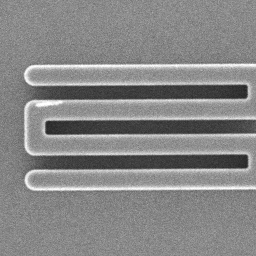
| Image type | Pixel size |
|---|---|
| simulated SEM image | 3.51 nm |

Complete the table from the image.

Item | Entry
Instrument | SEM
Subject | groups of lines, slits or small figures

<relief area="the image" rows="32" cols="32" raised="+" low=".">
................................
................................
................................
................................
................................
................................
................................
................................
....++++++++++++++++++++++++++++
...+++++++++++++++++++++++++++++
....++++++++++++++++++++++++++++
...............................+
..............++++++++++++++++++
...+++++++++++++++++++++++++++++
...+++++++++++++++++++++++++++++
...+++..........................
...+++..........................
...+++++++++++++++++++++++++++++
...+++++++++++++++++++++++++++++
...............................+
...............................+
....++++++++++++++++++++++++++++
...+++++++++++++++++++++++++++++
....++++++++++++++++++++++++++++
................................
................................
................................
................................
................................
................................
................................
................................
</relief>